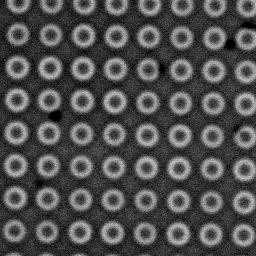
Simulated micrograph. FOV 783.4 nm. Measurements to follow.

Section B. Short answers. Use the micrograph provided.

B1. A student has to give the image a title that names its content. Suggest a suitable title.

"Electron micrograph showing an array of small figures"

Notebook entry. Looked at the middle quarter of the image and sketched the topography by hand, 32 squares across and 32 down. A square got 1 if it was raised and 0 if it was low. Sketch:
00111110001111100001111000011111
00111110001111100001111100011111
00111110000111100001111000011111
00001100000111000000111000001110
00000000000000000000000000000000
00000000000000000000000000000000
00000000000000000000000000000000
00011110000111100000110000001100
00111110001111100001111000011110
00111110001111100011111000011111
00111110001111100001111000011111
00011100000111100001111000011110
00000000000000000000000000000000
00000000000000000000000000000000
00000000000000000000000000000000
00011100000111000000110000001100
00111110001111100001111000011110
00111110001111100011111000111111
00111110001111100011111000111110
00011100000111000001111000011110
00000000000000000000000000001100
00000000000000000000000000000000
00000000000000000000000000000000
00011000000111000000110000000000
00111110001111100011111000011110
00111110001111100011111000111110
00111110001111100011111000111110
00111100001111000001111000111110
00000000000000000000000000001100
00000000000000000000000000000000
00000000000000000000000000000000
00011000000000000000000000000000